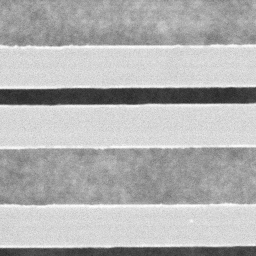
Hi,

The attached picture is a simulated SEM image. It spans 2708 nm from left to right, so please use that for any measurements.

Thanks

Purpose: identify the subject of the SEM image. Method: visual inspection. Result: lines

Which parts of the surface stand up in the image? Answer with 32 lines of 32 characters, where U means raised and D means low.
DDDDDDDDDDDDDDDDDDDDDDDDDDDDDDDD
DDDDDDDDDDDDDDDDDDDDDDDDDDDDDDDD
DDDDDDDDDDDDDDDDDDDDDDDDDDDDDDDD
DDDDDDDDDDDDDDDDDDDDDDDDDDDDDDDD
DDDDDDDDDDDDDDDDDDDDDDDDDDDDDDDD
DDDDDDDDDDDDDDDDDDDDDDDDDDDDDDDD
UUUUUUUUUUUUUUUUUUUUUUUUUUUUUUUU
UUUUUUUUUUUUUUUUUUUUUUUUUUUUUUUU
UUUUUUUUUUUUUUUUUUUUUUUUUUUUUUUU
UUUUUUUUUUUUUUUUUUUUUUUUUUUUUUUU
UUUUUUUUUUUUUUUUUUUUUUUUUUUUUUUU
DDDDDDDDDDDDDDDDDDDDDDDDDDDDDDDD
DDDDDDDDDDDDDDDDDDDDDDDDDDDDDDDD
UUUUUUUUUUUUUUUUUUUUUUUUUUUUUUUU
UUUUUUUUUUUUUUUUUUUUUUUUUUUUUUUU
UUUUUUUUUUUUUUUUUUUUUUUUUUUUUUUU
UUUUUUUUUUUUUUUUUUUUUUUUUUUUUUUU
UUUUUUUUUUUUUUUUUUUUUUUUUUUUUUUU
UUUDDDDDDDDDDDDDDDDDDDDDDDDDDDDD
DDDDDDDDDDDDDDDDDDDDDDDDDDDDDDDD
DDDDDDDDDDDDDDDDDDDDDDDDDDDDDDDD
DDDDDDDDDDDDDDDDDDDDDDDDDDDDDDDD
DDDDDDDDDDDDDDDDDDDDDDDDDDDDDDDD
DDDDDDDDDDDDDDDDDDDDDDDDDDDDDDDD
DDDDDDDDDDDDDDDDDDDDDDDDDDDDDDDD
DDDDDDDDDDDDDDDDDDDDDDDDDDDDDDDD
UUUUUUUUUUUUUUUUUUUUUUUUUUUUUUUU
UUUUUUUUUUUUUUUUUUUUUUUUUUUUUUUU
UUUUUUUUUUUUUUUUUUUUUUUUUUUUUUUU
UUUUUUUUUUUUUUUUUUUUUUUUUUUUUUUU
UUUUUUUUUUUUUUUUUUUUUUUUUUUUUUUU
DDDDDDDDDDDDDDDDDDDDDDDDDDDDDDDD